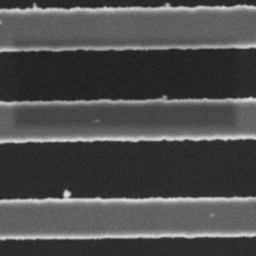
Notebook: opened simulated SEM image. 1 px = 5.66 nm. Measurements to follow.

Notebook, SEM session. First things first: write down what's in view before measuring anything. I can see lines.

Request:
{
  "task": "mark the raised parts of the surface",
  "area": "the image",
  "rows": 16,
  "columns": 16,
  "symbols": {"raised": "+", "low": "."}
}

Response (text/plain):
......++++++++++
++++++++++++++++
++++++++++++++++
................
................
................
++++++++++++++++
++++++++++++++++
++++++++++++++++
................
................
................
++++++++++++++++
++++++++++++++++
++++++++++++++++
................